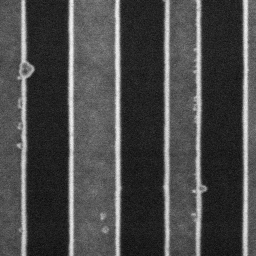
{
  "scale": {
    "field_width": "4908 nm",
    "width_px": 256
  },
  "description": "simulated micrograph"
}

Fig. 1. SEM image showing lines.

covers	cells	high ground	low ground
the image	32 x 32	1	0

00011111100000011111100001111110
00011111100000011111100001111110
00011111100000011111100001111110
00011111100000011111100001111110
00011111100000011111100001111110
00011111100000011111100001111110
00011111100000011111100001111110
00011111100000011111100001111110
00111111100000011111100001111110
00011111100000011111100001111110
00011111100000011111100001111110
00011111100000011111100001111110
00011111100000011111100001111110
00011111100000011111100001111110
00011111100000011111100001111110
00011111100000011111100001111110
00011111100000011111100001111110
00011111100000011111100001111110
00011111100000011111100001111110
00011111100000011111100001111110
00011111100000011111100001111110
00011111100000011111100001111110
00011111100000011111100001111110
00011111100000011111100001111110
00011111100000011111100001111110
00011111100000011111100001111110
00011111100000011111100001111110
00011111100000011111100001111110
00011111100000011111100001111110
00011111100000011111100001111110
00011111100000011111100001111110
00011111100000011111100001111110